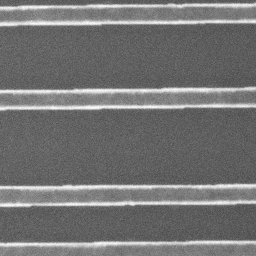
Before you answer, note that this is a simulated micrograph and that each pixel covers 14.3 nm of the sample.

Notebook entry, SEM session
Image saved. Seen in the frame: lines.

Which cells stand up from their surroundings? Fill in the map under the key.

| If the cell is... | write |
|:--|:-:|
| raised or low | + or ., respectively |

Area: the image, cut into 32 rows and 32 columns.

................................
++++++++++++++++++++++++++++++++
++++++++++++++++++++++++++++++++
................................
................................
................................
................................
................................
................................
................................
................................
++++++++++++++++++++++++++++++++
++++++++++++++++++++++++++++++++
++++++..........................
................................
................................
................................
................................
................................
................................
................................
................................
................................
++++++++++++++++++++++++++++++++
++++++++++++++++++++++++++++++++
+++++++++++.....................
................................
................................
................................
................................
..++++++++++++++++++++++++++++++
++++++++++++++++++++++++++++++++